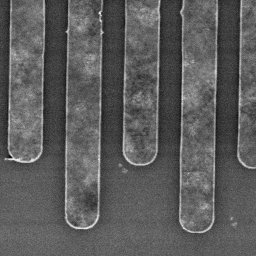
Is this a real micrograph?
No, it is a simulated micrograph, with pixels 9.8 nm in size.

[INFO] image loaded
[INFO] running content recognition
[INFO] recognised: parallel lines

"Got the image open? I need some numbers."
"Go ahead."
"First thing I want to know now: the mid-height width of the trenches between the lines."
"228 nm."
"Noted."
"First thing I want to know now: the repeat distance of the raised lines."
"0.563 µm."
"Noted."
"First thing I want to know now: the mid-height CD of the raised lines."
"333 nanometers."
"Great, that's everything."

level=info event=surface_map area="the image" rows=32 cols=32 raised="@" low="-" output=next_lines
-@@@@@---@@@@---@@@@---@@@@---@@
-@@@@@---@@@@---@@@@---@@@@---@@
-@@@@@---@@@@---@@@@---@@@@---@@
-@@@@@--@@@@@---@@@@---@@@@---@@
-@@@@@--@@@@@---@@@@---@@@@---@@
-@@@@----@@@@---@@@@---@@@@---@@
-@@@@---@@@@@---@@@@---@@@@---@@
-@@@@---@@@@@---@@@@---@@@@---@@
-@@@@---@@@@@---@@@@---@@@@---@@
-@@@@---@@@@@---@@@@---@@@@---@@
-@@@@---@@@@@---@@@@---@@@@---@@
-@@@@---@@@@@---@@@@---@@@@---@@
-@@@@---@@@@@---@@@@---@@@@---@@
-@@@@---@@@@@---@@@@---@@@@---@@
-@@@@---@@@@----@@@@---@@@@---@@
-@@@@---@@@@---@@@@@---@@@@---@@
-@@@@---@@@@---@@@@@---@@@@---@@
-@@@@---@@@@---@@@@@---@@@@---@@
-@@@@---@@@@---@@@@@---@@@@---@@
-@@@@---@@@@----@@@----@@@@---@@
--------@@@@-----@-----@@@@---@@
--------@@@@-----------@@@@-----
--------@@@@-----------@@@@-----
--------@@@@-----------@@@@-----
--------@@@@-----------@@@@-----
--------@@@@----------@@@@@-----
--------@@@@----------@@@@@-----
--------@@@@----------@@@@@-----
-----------------------@@@------
--------------------------------
--------------------------------
--------------------------------